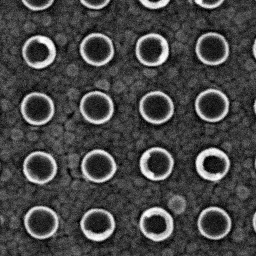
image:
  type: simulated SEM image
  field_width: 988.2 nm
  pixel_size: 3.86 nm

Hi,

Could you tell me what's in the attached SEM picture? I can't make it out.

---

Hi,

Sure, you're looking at a regular array of raised bodies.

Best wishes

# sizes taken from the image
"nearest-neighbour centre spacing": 56.3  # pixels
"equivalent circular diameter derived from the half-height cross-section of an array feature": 122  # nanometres